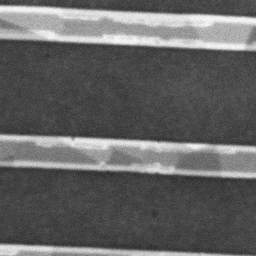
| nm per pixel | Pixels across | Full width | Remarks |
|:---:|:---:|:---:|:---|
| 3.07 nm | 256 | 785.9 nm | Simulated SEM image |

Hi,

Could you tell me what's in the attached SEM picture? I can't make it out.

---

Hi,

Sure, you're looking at one or a few lines or trenches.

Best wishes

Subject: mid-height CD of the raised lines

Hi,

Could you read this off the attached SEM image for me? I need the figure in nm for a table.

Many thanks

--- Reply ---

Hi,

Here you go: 82.4